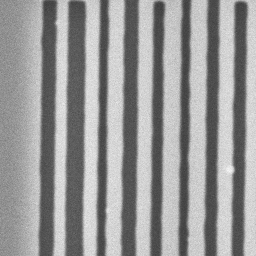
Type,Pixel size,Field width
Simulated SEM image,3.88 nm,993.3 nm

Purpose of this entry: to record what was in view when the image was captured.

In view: groups of lines, slits or small figures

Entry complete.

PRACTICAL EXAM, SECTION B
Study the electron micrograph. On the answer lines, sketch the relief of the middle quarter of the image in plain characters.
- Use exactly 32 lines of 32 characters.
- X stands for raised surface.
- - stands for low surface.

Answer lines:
X-----XXX--XXXX----XXX---XXXX---
X-----XXX--XXXX----XXX---XXXX---
X-----XXX--XXXX----XXX---XXXX---
X-----XXX--XXXX----XXX---XXXX---
X-----XXX--XXXX----XXX---XXXX---
X-----XXX--XXXX----XXX---XXXX---
X-----XXX--XXXX----XXX---XXXX---
X-----XXX--XXXX----XXX---XXXX---
X-----XXX--XXXX----XXX---XXXX---
X----XXXX--XXXX----XXX---XXXX---
X----XXXX--XXXX----XXX---XXXX---
X----XXXX--XXXX----XXX---XXXX---
X----XXXX--XXXX----XXX---XXXX---
X----XXXX--XXXX----XXX---XXXX---
X----XXXX--XXXX----XXX---XXXX---
X----XXXX--XXXX----XXX---XXXX---
X----XXX---XXXX----XXX---XXXX---
X----XXX---XXXX----XXX---XXXX---
-----XXX---XXXX---XXXX---XXXX---
-----XXX---XXXX---XXXX---XXXX---
-----XXX---XXXX----XXX---XXXX---
-----XXX---XXXX----XXX---XXXX--X
-----XXX---XXXX----XXX---XXXX--X
-----XXX---XXX----XXXX---XXXX--X
-----XXX---XXX----XXXX---XXXX--X
-----XXX---XXX----XXXX---XXXX--X
-----XXX---XXX----XXXX---XXXX--X
-----XXX---XXX----XXXX---XXXX--X
-----XXX---XXX----XXXX---XXXX--X
-----XXX---XXX----XXXX---XXXX--X
-----XXX---XXX----XXXX---XXXX--X
-----XXX---XXX----XXXX---XXXX--X